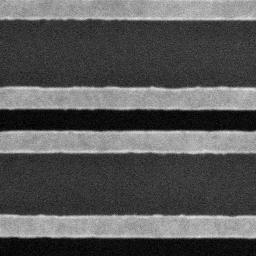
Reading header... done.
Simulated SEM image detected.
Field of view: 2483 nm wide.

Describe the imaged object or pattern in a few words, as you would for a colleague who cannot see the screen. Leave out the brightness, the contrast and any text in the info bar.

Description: lines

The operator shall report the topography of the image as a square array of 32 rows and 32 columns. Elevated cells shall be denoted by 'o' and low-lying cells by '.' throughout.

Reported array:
oooooooooooooooooooooooooooooooo
oooooooooooooooooooooooooooooooo
................................
................................
................................
................................
................................
................................
................................
................................
................................
oooooooooooooooooooooooooooooooo
oooooooooooooooooooooooooooooooo
oooooooooooooooooooooooooooooooo
................................
................................
oooooooooooooooooooooooooooooooo
oooooooooooooooooooooooooooooooo
oooooooooooooooooooooooooooooooo
................................
................................
................................
................................
................................
................................
................................
................................
oooooooooooooooooooooooooooooooo
oooooooooooooooooooooooooooooooo
oooooooooooooooooooooooooooooooo
................................
................................